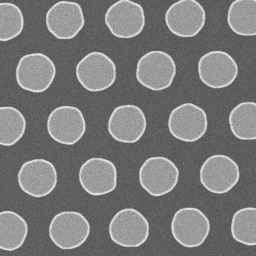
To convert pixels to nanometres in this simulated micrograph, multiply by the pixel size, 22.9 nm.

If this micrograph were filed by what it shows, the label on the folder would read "an array of small figures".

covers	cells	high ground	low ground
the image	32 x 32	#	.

#......##.....###.....###....###
###...####...#####...####....###
###...####...#####...#####..####
###...####....####...####....###
##.....##......##.....##........
................................
...................#......##....
...###....####...#####...####...
..#####...####...#####...#####..
..#####...####...#####...#####..
..####....####....###.....###...
................................
................................
##.....##......##.....###....###
###...####....####...#####...###
###...#####...####...#####...###
###...#####...####...#####...###
##.....###.....##......#........
................................
...........................#....
...###.....###....####...####...
..#####...####...#####...#####..
..#####...#####..#####...#####..
...####....###....####....###...
....#...........................
................................
##.............##.....###.....##
###....####...####....####...###
###...#####...####...#####...###
###...#####...####....####...###
###....###.....###.....##......#
................................